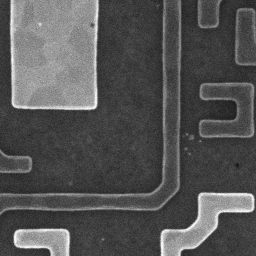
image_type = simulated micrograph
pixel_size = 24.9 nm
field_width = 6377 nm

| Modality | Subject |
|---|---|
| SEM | wiring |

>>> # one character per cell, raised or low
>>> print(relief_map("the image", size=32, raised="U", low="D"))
DUUUUUUUUUUUDDDDDDDDUUDDDUUDDDDD
DUUUUUUUUUUUDDDDDDDDUUDDDUUDDDUU
DUUUUUUUUUUUDDDDDDDDUUDDDUUDDDUU
DUUUUUUUUUUUDDDDDDDDUUDDDDDDDDUU
DUUUUUUUUUUUDDDDDDDDUUDDDDDDDDUU
DUUUUUUUUUUUDDDDDDDDUUDDDDDDDDUU
DUUUUUUUUUUUDDDDDDDDUUDDDDDDDDUU
DDUUUUUUUUUUDDDDDDDDUUDDDDDDDDUU
DDUUUUUUUUUUDDDDDDDDUUDDDDDDDDDD
DDUUUUUUUUUUDDDDDDDDUUDDDDDDDDDD
DDUUUUUUUUUUDDDDDDDDUUDDDDUUUUUD
DDUUUUUUUUUUDDDDDDDDUUDDDUUUUUUU
DDUUUUUUUUUUDDDDDDDDUUDDDDDDDUUU
DDDUUUUUUUUUDDDDDDDDUUDDDDDDDDUU
DDDDDDDDDDDDDDDDDDDDUUDDDDDDDDUU
DDDDDDDDDDDDDDDDDDDDUUDDDUUUUUUU
DDDDDDDDDDDDDDDDDDDDUUDDDUUUUUUU
DDDDDDDDDDDDDDDDDDDDUUDDDDDDDDDD
DDDDDDDDDDDDDDDDDDDDUUDDDDDDDDDD
UDDDDDDDDDDDDDDDDDDDUUDDDDDDDDDD
UUUUDDDDDDDDDDDDDDDDUUDDDDDDDDDD
DDDDDDDDDDDDDDDDDDDDUUDDDDDDDDDD
DDDDDDDDDDDDDDDDDDDDUUDDDDDDDDDD
DDDDDDDDDDDDDDDDDDDDUUDDDDDDDDDD
UUUUUUUUUUUUUUUUUUUUUUDDDUUUUUUD
UUUUUUUUUUUUUUUUUUUUUDDDDUUUUUUU
DDDDDDDDDDDDDDDDDDDDDDDDDUUUDDDD
DDDDDDDDDDDDDDDDDDDDDDDDDUUDDDDD
DDDDDDDDDDDDDDDDDDDDDDDUUUUDDDDD
DDUUUUUUUDDDDDDDDDDDUUUUUUDDDDDD
DDUUUUUUUDDDDDDDDDDDUUUUUDDDDDDD
DDDDDDUUUDDDDDDDDDDDUUUDDDDDDDDD